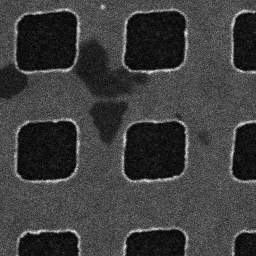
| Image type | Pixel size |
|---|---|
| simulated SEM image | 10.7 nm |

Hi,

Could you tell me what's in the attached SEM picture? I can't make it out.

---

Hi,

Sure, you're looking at holes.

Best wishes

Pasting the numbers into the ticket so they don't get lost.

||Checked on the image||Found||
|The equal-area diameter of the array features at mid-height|697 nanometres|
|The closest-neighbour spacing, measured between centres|1160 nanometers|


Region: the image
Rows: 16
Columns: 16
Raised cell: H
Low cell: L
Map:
HHHHHHHHHHHHHHHH
HLLLLHHHLLLLHHHL
HLLLLHHHLLLLHHHL
HLLLLHHHLLLLHHHL
HHHHHHHHHHHHHHHH
HHHHHHHHHHHHHHHH
HHHHHHHHHHHHHHHH
HHHHHHHHHHHHHHHH
HLLLLHHHLLLLHHHL
HLLLLHHHLLLLHHHL
HLLLLHHHLLLHHHLL
HHHHHHHHHHHHHHHH
HHHHHHHHHHHHHHHH
HHHHHHHHHHHHHHHH
HHHHHHHHHLLHHHHH
HLLLLHHHLLLLHHHL